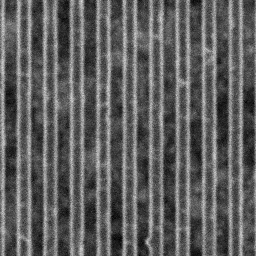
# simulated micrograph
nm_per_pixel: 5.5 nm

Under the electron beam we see parallel lines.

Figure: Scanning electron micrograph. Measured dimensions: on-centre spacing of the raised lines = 0.146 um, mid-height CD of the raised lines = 66.7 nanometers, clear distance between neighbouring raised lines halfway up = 80.4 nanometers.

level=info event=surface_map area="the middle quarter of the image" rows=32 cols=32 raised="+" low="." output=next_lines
..+++....++....+++....++....+++.
..+++....++....+++....++....+++.
..+++....++....+++....++....+++.
..+++....++....+++....++....+++.
..+++....++....+++....++....+++.
..+++....++....+++....++....+++.
..+++....++....+++....++....+++.
..+++....++....+++....++....+++.
..+++....++....+++....++....+++.
..+++....++....+++....++....+++.
..+++....++....+++....++....+++.
..+++....++....+++....++....+++.
..+++....++....+++....++....+++.
..+++....++....+++....++....+++.
..+++....++....+++....++....+++.
..+++...+++....+++....++....+++.
..+++...+++....+++....++....+++.
..+++...+++....+++....++....+++.
..+++...+++....+++....++....+++.
..+++...+++....+++....++....+++.
..+++...+++....+++....++....+++.
..+++...+++....+++....++....+++.
..+++...+++....+++....++....+++.
..+++...+++....+++....++....+++.
..+++....++....+++....++....+++.
..+++....++....+++....++....+++.
..+++....++....+++....++....+++.
..+++....++....+++...+++....+++.
..+++....++....+++....++....+++.
..+++....++....+++....++....+++.
..+++....++....+++....++....+++.
..+++....++....+++....++....+++.